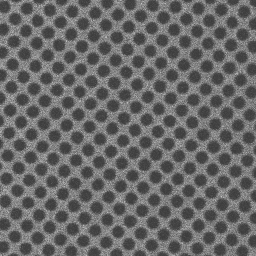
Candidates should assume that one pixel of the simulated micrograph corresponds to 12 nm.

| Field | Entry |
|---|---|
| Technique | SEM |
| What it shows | a regular array of holes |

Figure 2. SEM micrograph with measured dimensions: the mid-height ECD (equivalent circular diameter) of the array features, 13.1 pixels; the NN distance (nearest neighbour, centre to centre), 15.9 px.